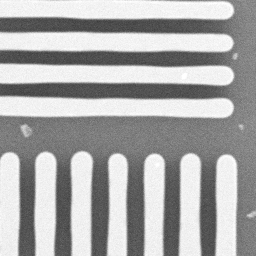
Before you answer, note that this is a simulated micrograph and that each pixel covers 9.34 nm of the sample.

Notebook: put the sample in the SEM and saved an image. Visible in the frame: groups of lines, slits or small figures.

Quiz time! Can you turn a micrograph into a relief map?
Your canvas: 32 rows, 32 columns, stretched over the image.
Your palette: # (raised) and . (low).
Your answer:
#############################...
#############################...
................................
................................
############################....
#############################...
................................
................................
############################....
#############################...
.........................###....
................................
############################....
#############################...
..........................##....
................................
................................
................................
................................
##...##..##...#....#...#........
##..###..##...##..##...##..##...
##..###..##...##..##...##..##...
##..###..##...##..##...##..##...
##..###..##...##..##...##..##...
##..###..##...##..##...##..##...
##..###..##...##..##...##..##...
##..###..##...##..##...##..##...
##..###..##...##..##...##..##...
##..###..##...##..##...##..##...
##..###..##...##..##...##..##...
##..###..##..###..##..###..##...
##..###..##..###..##..###..##...